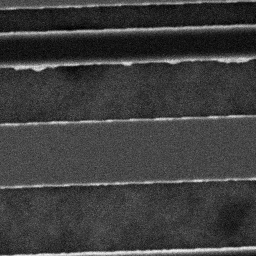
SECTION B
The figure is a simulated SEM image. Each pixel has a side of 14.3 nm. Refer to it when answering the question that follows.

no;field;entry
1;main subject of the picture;lines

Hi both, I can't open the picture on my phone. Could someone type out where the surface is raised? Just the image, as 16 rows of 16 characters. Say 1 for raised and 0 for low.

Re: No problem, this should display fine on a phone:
1110000000000000
0000000000000000
1111111111111111
1111111111111111
0000000000000000
0000000000000000
0000000000000000
0000000011111111
1111111111111111
1111111111111111
1111111111111111
1111111000000000
0000000000000000
0000000000000000
0000000000000000
0000000000000001